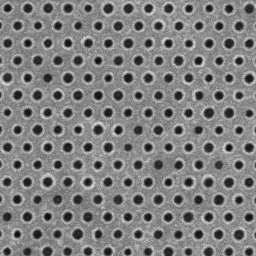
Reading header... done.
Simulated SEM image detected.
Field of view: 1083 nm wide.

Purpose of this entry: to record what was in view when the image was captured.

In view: a regular array of holes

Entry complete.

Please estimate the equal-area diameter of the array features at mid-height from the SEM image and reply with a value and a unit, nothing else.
39.9 nanometres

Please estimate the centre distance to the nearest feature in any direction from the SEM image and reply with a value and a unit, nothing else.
83.8 nanometers